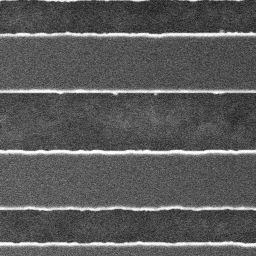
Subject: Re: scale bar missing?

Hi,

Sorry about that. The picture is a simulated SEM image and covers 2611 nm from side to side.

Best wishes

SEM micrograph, lines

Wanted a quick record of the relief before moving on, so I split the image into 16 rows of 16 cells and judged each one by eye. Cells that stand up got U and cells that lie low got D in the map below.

DDDDDDDDDDDDDDDD
DDDDDDDDDDDDDDDD
UUUUUUUUUUUUUUUU
UUUUUUUUUUUUUUUU
UUUUUUUUUUUUUUUU
UUUUUUUUUUUUUUUU
DDDDDDDDDDDDDDDD
DDDDDDDDDDDDDDDD
DDDDDDDDDDDDDDDD
UUUUUUUUUUUUUUUU
UUUUUUUUUUUUUUUU
UUUUUUUUUUUUUUUU
UUUUUUUUUUUUUUUU
DDDDDDDDDDDDDDDD
DDDDDDDDDDDDDDDD
UUUUUUUUUUUUUUUU